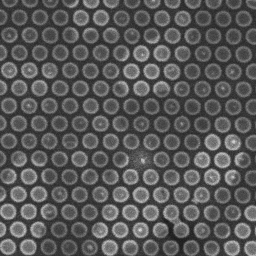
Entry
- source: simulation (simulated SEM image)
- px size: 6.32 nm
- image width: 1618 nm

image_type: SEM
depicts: a regular array of raised bodies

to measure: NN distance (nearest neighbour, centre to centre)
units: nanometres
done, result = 127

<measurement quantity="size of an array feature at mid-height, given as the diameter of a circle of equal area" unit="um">0.0938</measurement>